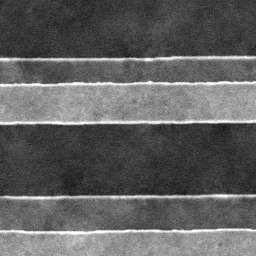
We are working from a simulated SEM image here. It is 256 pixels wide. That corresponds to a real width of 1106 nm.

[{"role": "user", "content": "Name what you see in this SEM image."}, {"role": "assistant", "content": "lines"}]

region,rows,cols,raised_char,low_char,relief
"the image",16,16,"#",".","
................
................
................
................
################
################
################
################
................
................
................
................
################
################
################
################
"